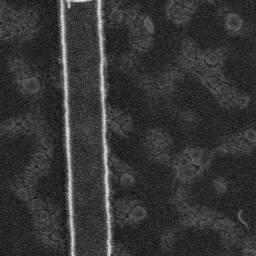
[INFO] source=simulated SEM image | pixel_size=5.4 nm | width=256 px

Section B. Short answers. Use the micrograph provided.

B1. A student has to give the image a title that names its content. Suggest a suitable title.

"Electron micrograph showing one or a few lines or trenches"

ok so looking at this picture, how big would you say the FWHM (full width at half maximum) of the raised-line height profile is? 204 nm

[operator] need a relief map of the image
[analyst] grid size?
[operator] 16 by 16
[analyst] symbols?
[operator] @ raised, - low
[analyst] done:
----@@----------
----@@----------
----@@----------
----@@----------
----@@----------
----@@----------
----@@----------
----@@@---------
----@@@---------
----@@@---------
----@@@---------
----@@@---------
----@@@---------
----@@@---------
----@@@---------
-----@@---------